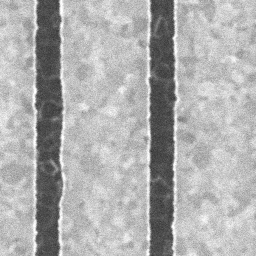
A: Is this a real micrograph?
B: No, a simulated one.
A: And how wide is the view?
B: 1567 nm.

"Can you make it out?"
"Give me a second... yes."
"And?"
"one or a few lines or trenches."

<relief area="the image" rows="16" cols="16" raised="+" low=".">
++..+++++..+++++
++..+++++..+++++
++..+++++..+++++
++..+++++..+++++
++..+++++..+++++
++..+++++..+++++
++..+++++..+++++
++..+++++..+++++
++..+++++..+++++
++..+++++..+++++
++..+++++..+++++
++..+++++..+++++
++..+++++..+++++
++..+++++..+++++
++..+++++..+++++
++..+++++..+++++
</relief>